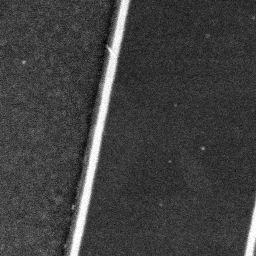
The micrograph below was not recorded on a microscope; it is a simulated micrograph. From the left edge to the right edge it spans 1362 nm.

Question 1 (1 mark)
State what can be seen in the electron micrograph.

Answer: one or a few lines or trenches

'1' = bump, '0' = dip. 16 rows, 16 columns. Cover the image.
0000000011111111
0000000011111111
0000000111111111
0000000111111111
0000000111111111
0000000111111111
0000001111111111
0000001111111111
0000001111111111
0000001111111111
0000001111111111
0000001111111111
0000011111111111
0000011111111111
0000011111111111
0000011111111111